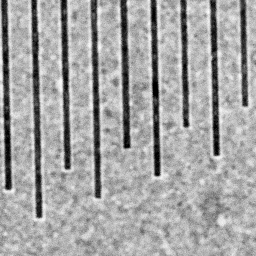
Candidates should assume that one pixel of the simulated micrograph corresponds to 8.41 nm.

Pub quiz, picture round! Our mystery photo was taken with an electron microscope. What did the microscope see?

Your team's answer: parallel lines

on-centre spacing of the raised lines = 251 nm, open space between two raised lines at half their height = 71.5 nanometers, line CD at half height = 183 nanometres